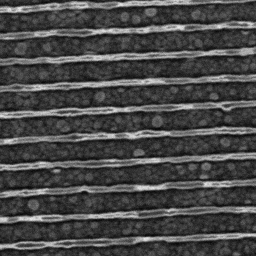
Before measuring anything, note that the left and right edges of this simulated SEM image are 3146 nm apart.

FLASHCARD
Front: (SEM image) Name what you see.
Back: parallel lines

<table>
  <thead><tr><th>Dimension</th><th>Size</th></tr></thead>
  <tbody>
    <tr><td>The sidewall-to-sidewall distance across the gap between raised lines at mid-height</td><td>262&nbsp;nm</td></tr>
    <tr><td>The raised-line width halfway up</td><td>67.5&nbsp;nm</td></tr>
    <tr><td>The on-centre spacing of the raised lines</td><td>323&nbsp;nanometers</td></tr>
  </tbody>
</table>